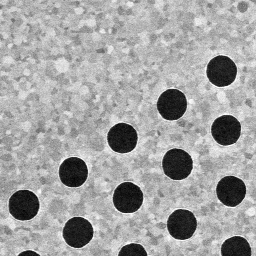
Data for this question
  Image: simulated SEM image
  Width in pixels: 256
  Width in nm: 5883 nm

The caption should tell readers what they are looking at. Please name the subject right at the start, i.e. a regular array of holes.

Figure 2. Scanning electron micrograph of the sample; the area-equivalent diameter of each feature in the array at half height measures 0.732 um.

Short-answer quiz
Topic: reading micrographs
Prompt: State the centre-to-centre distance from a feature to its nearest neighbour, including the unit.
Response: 1370 nanometres